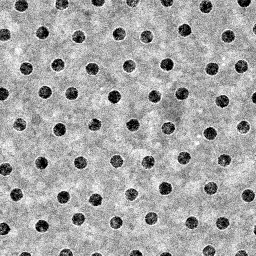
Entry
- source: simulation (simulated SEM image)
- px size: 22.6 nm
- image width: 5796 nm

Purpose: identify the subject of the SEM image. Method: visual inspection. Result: a regular array of holes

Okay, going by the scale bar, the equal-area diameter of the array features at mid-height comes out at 315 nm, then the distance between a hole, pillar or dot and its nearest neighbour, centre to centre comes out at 706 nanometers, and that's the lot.